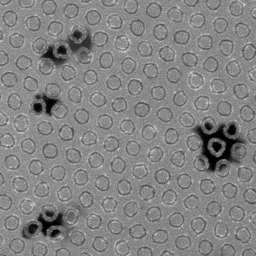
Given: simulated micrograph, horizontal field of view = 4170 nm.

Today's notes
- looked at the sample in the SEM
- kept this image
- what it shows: a regular array of ring-shaped raised bodies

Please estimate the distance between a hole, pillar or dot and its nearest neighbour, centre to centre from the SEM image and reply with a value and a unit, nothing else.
362 nanometers